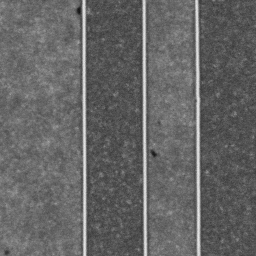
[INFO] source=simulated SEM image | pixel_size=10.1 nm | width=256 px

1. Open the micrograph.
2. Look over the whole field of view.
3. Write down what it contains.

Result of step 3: one or a few lines or trenches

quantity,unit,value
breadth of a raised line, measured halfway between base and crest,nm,609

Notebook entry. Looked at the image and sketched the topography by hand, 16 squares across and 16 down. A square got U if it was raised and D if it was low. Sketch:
DDDDDUUUUDDDUUUU
DDDDDUUUUDDDUUUU
DDDDDUUUUDDDUUUU
DDDDDUUUUDDDUUUU
DDDDDUUUUDDDUUUU
DDDDDUUUUDDDUUUU
DDDDDUUUUDDDUUUU
DDDDDUUUUDDDUUUU
DDDDDUUUUDDDUUUU
DDDDDUUUUDDDUUUU
DDDDDUUUUDDDUUUU
DDDDDUUUUDDDUUUU
DDDDDUUUUDDDUUUU
DDDDDUUUUDDDUUUU
DDDDDUUUUDDDUUUU
DDDDDUUUUDDDUUUU